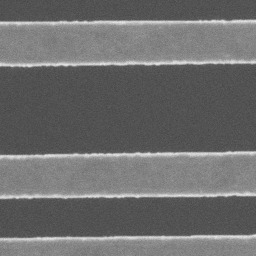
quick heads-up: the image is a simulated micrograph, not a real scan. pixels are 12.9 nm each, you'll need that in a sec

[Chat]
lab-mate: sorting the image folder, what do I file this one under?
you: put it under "lines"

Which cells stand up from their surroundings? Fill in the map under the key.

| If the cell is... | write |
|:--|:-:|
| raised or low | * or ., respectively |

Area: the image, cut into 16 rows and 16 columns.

................
****************
****************
****************
................
................
................
................
................
................
****************
****************
................
................
................
****************